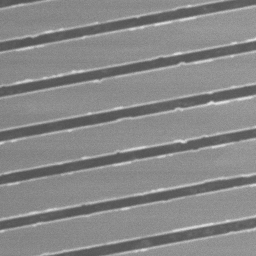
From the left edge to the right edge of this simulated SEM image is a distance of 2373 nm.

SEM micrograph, parallel lines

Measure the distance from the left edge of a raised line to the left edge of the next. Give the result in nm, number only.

404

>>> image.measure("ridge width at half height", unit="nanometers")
301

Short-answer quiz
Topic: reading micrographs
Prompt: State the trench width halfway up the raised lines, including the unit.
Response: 98 nanometres